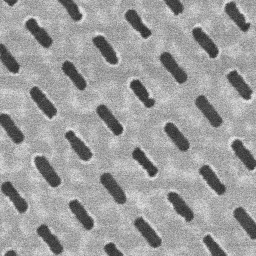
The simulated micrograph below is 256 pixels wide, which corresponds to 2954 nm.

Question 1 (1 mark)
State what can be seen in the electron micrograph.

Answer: a regular array of holes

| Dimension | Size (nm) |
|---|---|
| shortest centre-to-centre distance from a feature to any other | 471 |